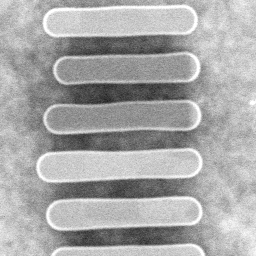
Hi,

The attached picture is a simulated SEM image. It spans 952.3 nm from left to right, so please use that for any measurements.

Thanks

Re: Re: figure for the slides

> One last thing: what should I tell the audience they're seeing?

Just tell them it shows groups of lines, slits or small figures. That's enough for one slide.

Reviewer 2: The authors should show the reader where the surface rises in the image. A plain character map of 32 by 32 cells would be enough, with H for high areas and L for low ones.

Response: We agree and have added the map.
LLLLLLLLLLLLLLLLLLLLLLLLLLLLLLLL
LLLLLLHHHHHHHHHHHHHHHHHHLLLLLLLL
LLLLLLHHHHHHHHHHHHHHHHHHLLLLLLLL
LLLLLLHHHHHHHHHHHHHHHHHHLLLLLLLL
LLLLLLLLLLLLLLLLLLLLLLLLLLLLLLLL
LLLLLLLLLLLLLLLLLLLLLLLLLLLLLLLL
LLLLLLLLLLLLLLLLLLLLLLLLLLLLLLLL
LLLLLLLHHHHHHHHHHHHHHHHHHLLLLLLL
LLLLLLLHHHHHHHHHHHHHHHHHHLLLLLLL
LLLLLLLHHHHHHHHHHHHHHHHHLLLLLLLL
LLLLLLLLLLLLLLLLLLLLLLLLLLLLLLLL
LLLLLLLLLLLLLLLLLLLLLLLLLLLLLLLL
LLLLLLLLLLLLLLLLLLLLLLLLLLLLLLLL
LLLLLLHHHHHHHHHHHHHHHHHHHLLLLLLL
LLLLLLHHHHHHHHHHHHHHHHHHHLLLLLLL
LLLLLLHHHHHHHHHHHHHHHHHHHLLLLLLL
LLLLLLLHHHHLLLLLLLLLLLLLLLLLLLLL
LLLLLLLLLLLLLLLLLLLLLLLLLLLLLLLL
LLLLLLLLLLLLLLLLLLLLLLLLLLLLLLLL
LLLLLHHHHHHHHHHHHHHHHHHHHLLLLLLL
LLLLLHHHHHHHHHHHHHHHHHHHHLLLLLLL
LLLLLHHHHHHHHHHHHHHHHHHHHLLLLLLL
LLLLLLHHHHHLLLLLLLLLLLLLLLLLLLLL
LLLLLLLLLLLLLLLLLLLLLLLLLLLLLLLL
LLLLLLLLLLLLLLLLLLLLLLLLLLLLLLLL
LLLLLLLHHHHHHHHHHHHHHHHHHLLLLLLL
LLLLLLHHHHHHHHHHHHHHHHHHHLLLLLLL
LLLLLLHHHHHHHHHHHHHHHHHHHLLLLLLL
LLLLLLLHHHHHLLLLLLLLLLLLLLLLLLLL
LLLLLLLLLLLLLLLLLLLLLLLLLLLLLLLL
LLLLLLLLLLLLLLLLLLLLLLLLLLLLLLLL
LLLLLLLHHHHHHHHHHHHHHHHHHLLLLLLL